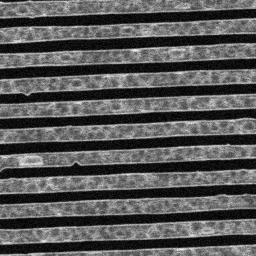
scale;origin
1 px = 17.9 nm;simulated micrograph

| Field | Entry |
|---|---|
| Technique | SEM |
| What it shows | parallel lines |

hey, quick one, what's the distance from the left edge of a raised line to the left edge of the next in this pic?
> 450 nanometres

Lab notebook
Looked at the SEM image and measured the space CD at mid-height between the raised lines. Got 11 px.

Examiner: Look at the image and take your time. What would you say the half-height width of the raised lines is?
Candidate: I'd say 258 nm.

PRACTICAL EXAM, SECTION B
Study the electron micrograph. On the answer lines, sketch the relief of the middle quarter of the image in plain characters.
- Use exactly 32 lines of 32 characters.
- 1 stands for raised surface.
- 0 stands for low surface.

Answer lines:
00000000000000000000000000000000
00000000000000000000000000000000
00000000000000000011111111111111
11111111110111011111111111111111
11111111111111011111111111111111
11111111111111111111111111110000
11000000000000000000000000000000
00000000000000000000000000000000
00000000000000000000001111111111
00111111111111111111111111111111
11111111111111111111111111111111
11111111111111111111111111111110
11111111111100000000000000000000
00000000000000000000000000000000
00000000000000000000000000000001
00000000000111111111111111111110
11111111111111111111111111111111
11111111111111111111111111111111
11111111111111111000000000000000
00000000000000000000000000000000
00000000000000000000000000000000
00000000000000000111111111111111
11111111111111111111111111111111
11111111111111111111111111111111
11111111111111111111111100000000
00000000000000000000000000000000
00000000000000000000000000000000
00000000000000000001111111111111
11111111111111111111111111111111
11111111111111111111111111111111
11111111111111111111111111110000
11111111000000000000000000000000